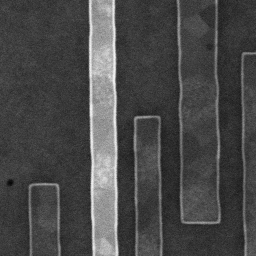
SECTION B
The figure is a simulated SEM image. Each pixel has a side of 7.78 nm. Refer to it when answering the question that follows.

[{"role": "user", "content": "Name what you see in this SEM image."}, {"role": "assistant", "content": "groups of lines, slits or small figures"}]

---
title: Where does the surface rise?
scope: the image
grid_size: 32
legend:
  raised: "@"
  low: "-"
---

-----------@@@--------@@@@@-----
-----------@@@--------@@@@@-----
-----------@@@--------@@@@@-----
-----------@@@--------@@@@@-----
-----------@@@--------@@@@@-----
-----------@@@--------@@@@@-----
-----------@@@--------@@@@@-----
-----------@@@--------@@@@@---@@
-----------@@@--------@@@@@---@@
-----------@@@--------@@@@@---@@
-----------@@@---------@@@@---@@
-----------@@@---------@@@@---@@
-----------@@@---------@@@@---@@
-----------@@@--------@@@@@---@@
-----------@@@--------@@@@@---@@
-----------@@@---@@@---@@@@---@@
-----------@@@---@@@---@@@@---@@
-----------@@@---@@@---@@@@---@@
-----------@@@@--@@@---@@@@---@@
------------@@@--@@@---@@@@---@@
------------@@@--@@@---@@@@----@
------------@@---@@@---@@@@----@
------------@@---@@@---@@@@----@
----@@@-----@@@--@@@---@@@@----@
----@@@-----@@@--@@@---@@@@----@
----@@@-----@@@--@@@---@@@@----@
----@@@-----@@@--@@@---@@@@----@
----@@@-----@@@--@@@---@@@@----@
----@@@-----@@@--@@@-----------@
----@@@-----@@@--@@@-----------@
----@@@-----@@@--@@@-----------@
----@@@-----@@@--@@@-----------@